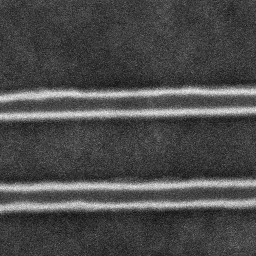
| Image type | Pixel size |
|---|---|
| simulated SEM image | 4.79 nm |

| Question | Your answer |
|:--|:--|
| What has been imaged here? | one or a few lines or trenches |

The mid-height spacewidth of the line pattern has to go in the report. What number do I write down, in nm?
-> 346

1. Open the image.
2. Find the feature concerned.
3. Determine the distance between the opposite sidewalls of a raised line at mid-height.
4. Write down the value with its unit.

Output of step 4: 20.1 px